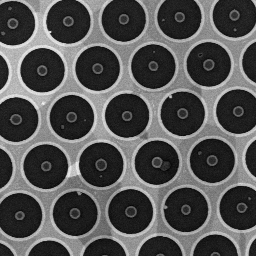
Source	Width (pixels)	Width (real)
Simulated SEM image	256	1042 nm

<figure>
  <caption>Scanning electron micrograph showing an array of small figures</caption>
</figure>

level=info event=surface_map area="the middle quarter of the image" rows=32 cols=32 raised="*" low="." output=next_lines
.*......*.....**......*.....**..
.**.....*.....***...........**..
***...........***...........***.
***...........***..........****.
****.........*****.........*****
*****.......*******.......******
******.....***********.******.**
*..**********.....********......
.....*******........*****.......
......*****..........****.......
.......***...........***........
........**...........***.....*..
.**.....**.....**.....**.....**.
.**.....**.....**.....**........
........**...........***........
........***..........****.......
.......****.........*****.......
......******........******......
.....*********....**************
********...*********......******
******.......******........*****
*****.........****..........****
****..........****...........**.
.***...........**............**.
.**.....**.....**.....**.....**.
.**.....***....**.....**.....**.
.***...........***...........***
.***...........***..........****
.***..........*****.........****
*****........*******......******
*******.....**********..********
***.**********.....********.....